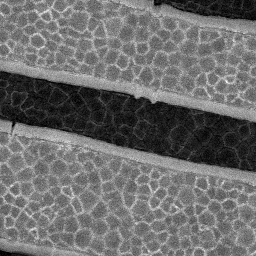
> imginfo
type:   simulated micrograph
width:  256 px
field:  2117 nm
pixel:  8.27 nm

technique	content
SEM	one or a few lines or trenches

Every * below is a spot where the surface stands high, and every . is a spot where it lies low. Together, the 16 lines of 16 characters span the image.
**********......
**************..
****************
****************
..**************
........********
............****
................
****............
********........
************....
****************
****************
****************
****************
.***************